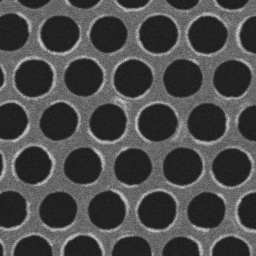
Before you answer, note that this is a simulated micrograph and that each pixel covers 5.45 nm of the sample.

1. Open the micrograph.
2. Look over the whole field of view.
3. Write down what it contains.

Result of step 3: a regular array of holes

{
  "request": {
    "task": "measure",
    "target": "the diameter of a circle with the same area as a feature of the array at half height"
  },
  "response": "0.209 um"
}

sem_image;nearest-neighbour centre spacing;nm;269